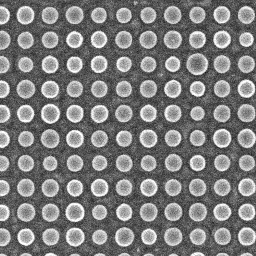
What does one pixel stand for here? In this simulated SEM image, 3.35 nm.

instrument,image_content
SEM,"a regular array of raised bodies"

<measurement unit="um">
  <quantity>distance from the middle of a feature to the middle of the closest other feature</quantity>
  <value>0.0816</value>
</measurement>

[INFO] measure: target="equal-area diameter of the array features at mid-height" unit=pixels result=16.7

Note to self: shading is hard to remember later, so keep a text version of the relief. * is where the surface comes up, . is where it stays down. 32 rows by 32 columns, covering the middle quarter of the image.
.***...****..****..****..****..*
.***...***....**....**....**...*
................................
................................
..**....**....**....**....**....
.***...****..****..****..****...
.****..****..****..****..****...
.***...***...****..****..****...
................................
................................
..**....**....**....**....**....
.****..****..****..****..****...
.****..****..****..****..****...
.***...****..****..****..****...
..*.....**......................
................................
....................*...........
.***...***...****..****...***...
.****..****..****..****..****...
.****..****..****..****..****...
..**....**....**....**..........
................................
................................
.***....**...***....**....***...
.****..****..****..****..****...
.****..***...****..****..****...
.***....**....**....**....***...
................................
................................
.***...***....**....***...***...
.***...****..****..****..****..*
.****..****..****..****..****...